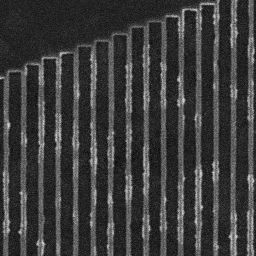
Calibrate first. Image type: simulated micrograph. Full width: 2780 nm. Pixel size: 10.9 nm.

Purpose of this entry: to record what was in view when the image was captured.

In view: parallel lines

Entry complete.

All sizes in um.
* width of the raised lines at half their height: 0.0461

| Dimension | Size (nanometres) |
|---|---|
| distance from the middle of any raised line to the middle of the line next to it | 190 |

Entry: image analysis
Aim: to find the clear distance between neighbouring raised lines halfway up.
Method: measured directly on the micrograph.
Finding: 137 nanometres